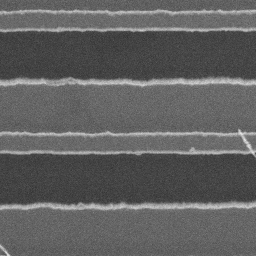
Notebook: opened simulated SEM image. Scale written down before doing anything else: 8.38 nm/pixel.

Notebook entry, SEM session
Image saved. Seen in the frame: lines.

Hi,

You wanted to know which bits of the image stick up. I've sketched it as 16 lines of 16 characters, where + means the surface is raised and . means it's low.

++++++++++++++++
++++++++++++++++
................
................
................
++++++++++++++++
++++++++++++++++
++++++++++++++++
++++++++++++++++
++++++++++++++++
................
................
................
++++++++++++++++
++++++++++++++++
++++++++++++++++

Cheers